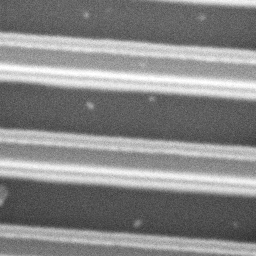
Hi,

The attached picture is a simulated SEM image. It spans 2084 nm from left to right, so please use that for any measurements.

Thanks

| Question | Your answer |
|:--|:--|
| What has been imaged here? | lines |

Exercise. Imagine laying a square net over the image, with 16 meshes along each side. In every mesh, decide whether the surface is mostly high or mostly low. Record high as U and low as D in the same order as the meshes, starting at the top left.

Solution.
DDDDDDDDDDDDDDDD
DDDDDDDDDDDDDDDD
UUUUUUDDDDDDDDDD
UUUUUUUUUUUUUUUU
UUUUUUUUUUUUUUUU
DDDDDDDDDDUUUUUU
DDDDDDDDDDDDDDDD
DDDDDDDDDDDDDDDD
UUUUUDDDDDDDDDDD
UUUUUUUUUUUUUUUU
UUUUUUUUUUUUUUUU
DDDDDDDDDDUUUUUU
DDDDDDDDDDDDDDDD
DDDDDDDDDDDDDDDD
UUUUUDDDDDDDDDDD
UUUUUUUUUUUUUUUU